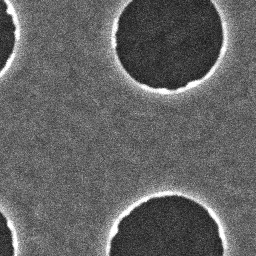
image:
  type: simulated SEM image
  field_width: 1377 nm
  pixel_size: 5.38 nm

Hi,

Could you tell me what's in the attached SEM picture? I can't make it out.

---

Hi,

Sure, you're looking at holes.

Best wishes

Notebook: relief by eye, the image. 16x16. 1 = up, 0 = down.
1111111100000111
0111111000000011
0111111000000011
0111111000000011
1111111100000111
1111111111011111
1111111111111111
1111111111111111
1111111111111111
1111111111111111
1111111111111111
1111111111111111
1111111110001111
1111111100000111
0111111000000011
0111111000000011